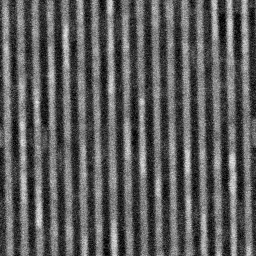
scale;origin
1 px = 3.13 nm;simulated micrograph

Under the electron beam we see parallel lines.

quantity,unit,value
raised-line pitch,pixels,15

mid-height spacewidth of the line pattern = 0.0321 um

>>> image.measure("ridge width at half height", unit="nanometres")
14.5